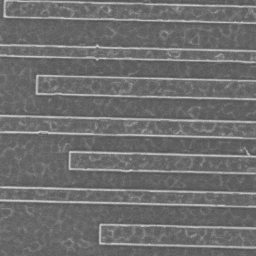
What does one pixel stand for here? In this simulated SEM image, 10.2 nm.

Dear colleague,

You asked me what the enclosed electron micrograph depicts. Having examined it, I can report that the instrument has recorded parallel lines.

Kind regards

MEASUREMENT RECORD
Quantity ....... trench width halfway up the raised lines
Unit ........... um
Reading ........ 0.213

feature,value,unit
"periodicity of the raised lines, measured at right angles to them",0.38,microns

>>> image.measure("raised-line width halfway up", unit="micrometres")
0.175